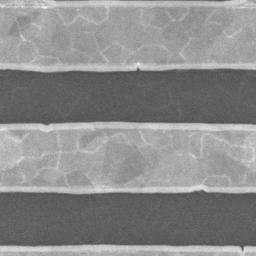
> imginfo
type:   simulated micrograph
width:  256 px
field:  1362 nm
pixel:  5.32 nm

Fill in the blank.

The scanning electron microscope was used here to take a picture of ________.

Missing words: one or a few lines or trenches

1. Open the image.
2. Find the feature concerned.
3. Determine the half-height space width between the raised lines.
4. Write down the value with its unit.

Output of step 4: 306 nanometers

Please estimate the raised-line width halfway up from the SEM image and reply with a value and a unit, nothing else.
65.1 px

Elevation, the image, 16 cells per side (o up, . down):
oooooooooooooooo
oooooooooooooooo
oooooooooooooooo
oooooooooooooooo
................
................
................
................
oooooooooooooooo
oooooooooooooooo
oooooooooooooooo
oooooooooooooooo
................
................
................
.....oooooo.....